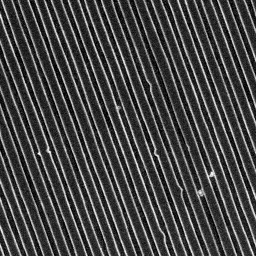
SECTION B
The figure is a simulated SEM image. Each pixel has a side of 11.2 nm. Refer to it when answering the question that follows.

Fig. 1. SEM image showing parallel lines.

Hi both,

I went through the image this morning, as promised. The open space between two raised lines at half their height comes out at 5.76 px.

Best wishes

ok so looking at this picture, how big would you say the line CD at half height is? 9.52 px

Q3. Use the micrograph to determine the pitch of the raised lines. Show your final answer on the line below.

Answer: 176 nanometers